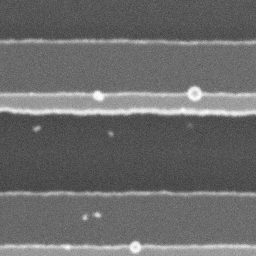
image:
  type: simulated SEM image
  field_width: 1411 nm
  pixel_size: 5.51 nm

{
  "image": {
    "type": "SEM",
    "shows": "lines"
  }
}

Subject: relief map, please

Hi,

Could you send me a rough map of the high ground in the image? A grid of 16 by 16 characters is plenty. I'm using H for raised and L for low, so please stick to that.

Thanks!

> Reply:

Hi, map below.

LLLLLLLLLLLLLLLL
LLLLLLLLLLLLLLLL
LLLLLLLLLLLLLLLL
HHHHHHHHHHHHHHHH
HHHHHHHHHHHHHHHH
HHHHHHHHHHHHHHHH
HHHHHHHHHHHHHHHH
LLLLLLLLLLLLLLLL
LLLLLLLLLLLLLLLL
LLLLLLLLLLLLLLLL
LLLLLLLLLLLLLLLL
LLLLLLLLLLLLLLLL
HHHHHHHHHHHHHHHH
HHHHHHHHHHHHHHHH
HHHHHHHHHHHHHHHH
HHHHHHHHHHHHHHHH